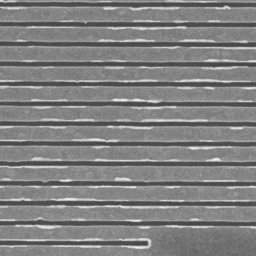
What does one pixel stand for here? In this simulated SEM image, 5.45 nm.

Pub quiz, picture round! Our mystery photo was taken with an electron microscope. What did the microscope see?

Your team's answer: parallel lines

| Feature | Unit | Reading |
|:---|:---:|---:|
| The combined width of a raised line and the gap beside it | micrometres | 0.108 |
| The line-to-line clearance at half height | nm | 27.9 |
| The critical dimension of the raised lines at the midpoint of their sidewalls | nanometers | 80.4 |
